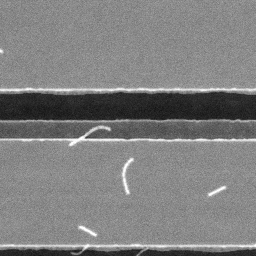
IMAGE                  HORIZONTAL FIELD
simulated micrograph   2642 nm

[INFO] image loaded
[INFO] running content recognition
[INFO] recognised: lines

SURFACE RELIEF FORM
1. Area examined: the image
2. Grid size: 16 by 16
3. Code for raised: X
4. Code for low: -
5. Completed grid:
XXXXXXXXXXXXXXXX
XXXXXXXXXXXXXXXX
XXXXXXXXXXXXXXXX
XXXXXXXXXXXXXXXX
XXXXXXXXXXXXXXXX
XXXXXXXXXXXXXXXX
----------------
----------------
XXXXXXXXXXXXXXXX
XXXXXXXXXXXXXXXX
XXXXXXXXXXXXXXXX
XXXXXXXXXXXXXXXX
XXXXXXXXXXXXXXXX
XXXXXXXXXXXXXXXX
XXXXXXXXXXXXXXXX
----------------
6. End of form